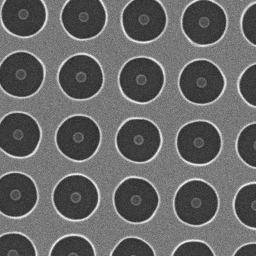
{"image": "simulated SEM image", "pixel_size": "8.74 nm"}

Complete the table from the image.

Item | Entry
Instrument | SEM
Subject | an array of small figures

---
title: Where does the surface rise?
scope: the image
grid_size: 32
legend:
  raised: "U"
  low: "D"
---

DDDDDUUUDDDDDUUUDDDDUUUUDDDUUUUU
DDDDDDUUDDDDDUUDDDDDDUUDDDDDUUUD
DDDDDDUUDDUDDUUDDUUDDUUDDUDDUUDD
UDDDDUUUDDDDDUUDDDDDDUUDDDDDUUDD
UUDDUUUUUDDDUUUUDDDDUUUDDDDDUUUD
UUUUUUUUUUUUUUUUUUUUUUUUUDUUUUUU
UUDUUUUUUUUUUUUUUUUUUUUUUUUUUUUU
UDDDDUUUDDDDUUUUDDDUUUUUUUUUUUUU
DDDDDUUUDDDDDUUDDDDDUUUDDDDUUUUD
DDUDDUUDDDUDDUUDDDDDDUUDDDDDUUDD
DDDDDUUDDDDDDUUDDDDDUUDDDUDDUUDD
UDDDUUUUDDDDUUUDDDDDUUUDDDDDUUDD
UUUUUUUUUUUUUUUUUDDUUUUDDDDUUUUD
UUUUUUUUUUUUUUUUUUUUUUUUUUUUUUUU
UDDDUUUUUDUUUUUUUUUUUUUUUUUUUUUU
DDDDDUUUDDDDUUUDDDDUUUUDDDUUUUUU
DDUDDUUDDDDDUUUDDDDDUUDDDDDUUUDD
DDDDDUUDDUDDDUUDDUDDUUDDDDDDUUDD
DDDDDUUDDDDDUUUDDDDDUUDDDDDDUUDD
UUDUUUUUDDDUUUUDDDDUUUUDDDDUUUDD
UUUUUUUUUUUUUUUUUUUUUUUUDDUUUUUD
UUUUUUUUUUUUUUUUUUUUUUUUUUUUUUUU
DDDDUUUUDDDUUUUUDDUUUUUUDUUUUUUU
DDDDDUUDDDDDUUUDDDDUUUDDDDDUUUDD
DUDDDUUDDUDDUUDDDDDDUUDDDDDUUUDD
DDDDUUUDDDDDUUDDDDDDUUDDUDDUUDDD
DDDDUUUDDDDDUUUDDDDUUUDDDDDUUDDD
UUUUUUUUUDUUUUUUDDUUUUUDDDUUUUDD
UUUUUUUUUUUUUUUUUUUUUUUUUUUUUUUU
DDDUUUUUUDUUUUUUUUUUUUUUUUUUUUUU
DDDDUUUDDDDUUUUDDDUUUUUDDDUUUUUD
DUDDUUDDDDDDUUDDDDDUUUDDDDDUUDDD